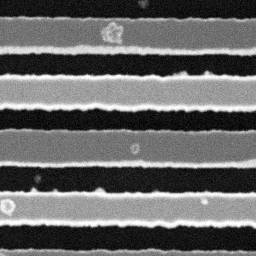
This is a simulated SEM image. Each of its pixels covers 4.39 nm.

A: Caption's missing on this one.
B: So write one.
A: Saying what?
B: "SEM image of lines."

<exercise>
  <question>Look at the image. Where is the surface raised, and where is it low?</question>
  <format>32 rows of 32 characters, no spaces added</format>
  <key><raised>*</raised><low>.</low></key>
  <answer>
................................
................................
********************************
********************************
********************************
********************************
...................********.****
................................
................................
.....*.*..*...**..........*.....
********************************
********************************
********************************
......*.*.*..*.***.*************
................................
................................
********************************
********************************
********************************
********************************
********************************
................................
................................
................................
********************************
********************************
********************************
********************************
................................
................................
................................
***********************.*******.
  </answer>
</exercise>